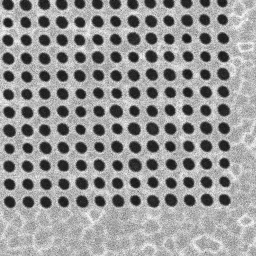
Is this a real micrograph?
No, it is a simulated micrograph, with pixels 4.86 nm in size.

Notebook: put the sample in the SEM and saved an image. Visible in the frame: a regular array of holes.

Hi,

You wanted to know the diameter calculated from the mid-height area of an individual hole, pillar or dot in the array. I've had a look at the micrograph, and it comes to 54.8 nm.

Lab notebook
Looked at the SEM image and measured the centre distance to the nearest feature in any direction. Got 84.5 nm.